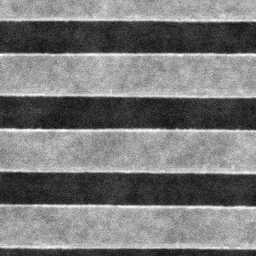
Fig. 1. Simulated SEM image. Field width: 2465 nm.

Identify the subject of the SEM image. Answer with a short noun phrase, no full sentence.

lines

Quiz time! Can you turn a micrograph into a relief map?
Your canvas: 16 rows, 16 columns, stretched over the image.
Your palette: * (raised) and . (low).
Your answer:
****************
................
................
****************
****************
****************
................
................
****************
****************
****************
................
................
****************
****************
............****